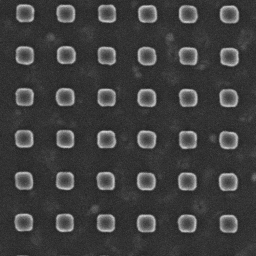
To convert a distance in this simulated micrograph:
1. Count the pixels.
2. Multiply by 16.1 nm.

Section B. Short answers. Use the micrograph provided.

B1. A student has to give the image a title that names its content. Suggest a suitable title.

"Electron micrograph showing a regular array of raised bodies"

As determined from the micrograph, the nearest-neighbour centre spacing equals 657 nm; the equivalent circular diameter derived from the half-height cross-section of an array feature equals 18.3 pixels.